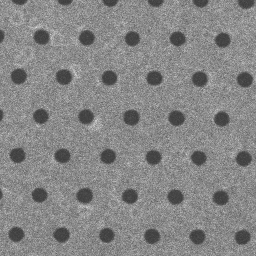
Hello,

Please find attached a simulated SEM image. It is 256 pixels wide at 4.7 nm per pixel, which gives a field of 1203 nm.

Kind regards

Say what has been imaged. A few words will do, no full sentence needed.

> a regular array of holes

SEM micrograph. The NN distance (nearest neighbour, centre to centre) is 212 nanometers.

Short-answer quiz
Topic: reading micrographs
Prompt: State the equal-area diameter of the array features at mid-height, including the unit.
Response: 73 nanometers